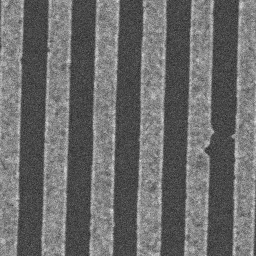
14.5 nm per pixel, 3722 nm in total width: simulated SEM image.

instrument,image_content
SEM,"parallel lines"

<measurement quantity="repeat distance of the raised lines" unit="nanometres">690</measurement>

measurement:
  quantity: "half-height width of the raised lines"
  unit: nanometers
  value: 292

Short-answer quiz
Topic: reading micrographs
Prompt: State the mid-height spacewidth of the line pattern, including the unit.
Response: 398 nanometers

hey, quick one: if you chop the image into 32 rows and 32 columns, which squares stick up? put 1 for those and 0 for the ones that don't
11100011100011100011100011000011
11100011100011100011100011000011
11100011100011100011100011000011
11100011100011100011100011000011
11100011100011100011100011000011
11100011100011100011000011000011
11100011100011100011000011000011
11000011100011100011000011000011
11000011100011000011000011000011
11000011100011000011000011000011
11000011000011000011000011000011
11000011000011000011000011000011
11000011000011000011000011000011
11000011000011000011000011000011
11000011000011000011000011000011
11000011000011000011000011000011
11000011000011000011000011000011
11000011000011000011000011000111
11000011000011000011000011000011
11000011000011000011000011000111
11000011000011000011000011000011
11000011000011000011000111000011
11000011000011000011000111000011
11000011000011000111000111000111
11000011000011000111000011000111
11000011000011000111000111000111
11000011000011000111000111000111
11000111000011000111000111000111
11000111000011000111000111000111
11000111000111000111000111000111
11000111000111000111000111000110
11000111000111000111000111000110